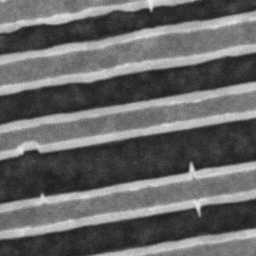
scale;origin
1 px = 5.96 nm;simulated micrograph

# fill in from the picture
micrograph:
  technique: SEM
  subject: one or a few lines or trenches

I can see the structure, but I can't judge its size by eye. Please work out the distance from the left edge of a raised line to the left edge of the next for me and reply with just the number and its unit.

0.432 um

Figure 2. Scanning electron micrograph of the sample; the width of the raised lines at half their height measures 171 nm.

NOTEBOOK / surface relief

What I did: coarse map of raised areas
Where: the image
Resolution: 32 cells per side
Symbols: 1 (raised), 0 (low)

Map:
11111111111111111110000000000000
11111111111000000000000000000000
11111110000000000000000000000111
10000000000000000000001111111111
00000000000000000111111111111111
00000000000001111111111111111111
00000011111111111111111111111000
11111111111111111111111100000000
11111111111111110000000000000000
11111111111100000000000000000000
11111000000000000000000000000000
00000000000000000000000000001111
00000000000000000000011111111111
00000000000000001111111111111111
00000000001111111111111111111110
00011111111111111111111100000000
11111111111111111100000000000000
11111111111100000000000000000000
11100100000000000000000000000000
00000000000000000000000000000000
00000000000000000000000000000000
00000000000000000000000000111111
00000000000000000000011111111111
00000000000000011111111111111111
00000000011111111111111111111110
00011111111111111111111110000000
11111111111111111110000000000000
11111111111100000000000000000000
11111110000000000000000000000000
00000000000000000000000000000111
00000000000000000000000111111111
00000000000000000111111111111111